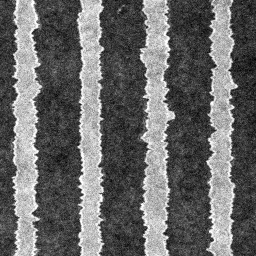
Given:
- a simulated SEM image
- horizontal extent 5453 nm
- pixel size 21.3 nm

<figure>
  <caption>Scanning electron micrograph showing one or a few lines or trenches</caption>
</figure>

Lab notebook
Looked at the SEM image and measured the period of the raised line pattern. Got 1390 nanometers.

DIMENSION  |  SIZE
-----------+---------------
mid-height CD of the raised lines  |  0.421 micrometres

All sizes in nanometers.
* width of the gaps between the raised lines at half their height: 974